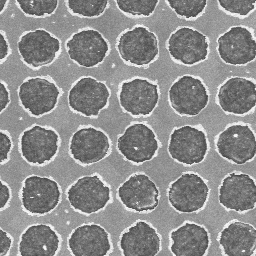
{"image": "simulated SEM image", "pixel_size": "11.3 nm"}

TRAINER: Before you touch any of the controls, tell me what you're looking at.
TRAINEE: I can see a regular array of holes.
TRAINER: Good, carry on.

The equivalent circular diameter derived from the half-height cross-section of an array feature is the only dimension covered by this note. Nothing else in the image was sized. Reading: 432 nm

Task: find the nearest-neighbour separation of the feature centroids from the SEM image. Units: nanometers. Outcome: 548